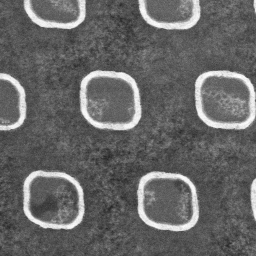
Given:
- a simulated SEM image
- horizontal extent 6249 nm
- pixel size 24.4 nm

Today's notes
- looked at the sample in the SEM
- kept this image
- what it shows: raised bodies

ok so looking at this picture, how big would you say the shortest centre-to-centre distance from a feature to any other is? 2.8 µm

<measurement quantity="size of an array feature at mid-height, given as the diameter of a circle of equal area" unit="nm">1390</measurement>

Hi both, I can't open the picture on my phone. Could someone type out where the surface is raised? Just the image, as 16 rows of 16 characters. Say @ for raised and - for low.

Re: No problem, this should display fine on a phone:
--@@@----@@@----
---@@-----@@----
----------------
----------------
----------------
@----@@@----@@@@
@----@@@@---@@@@
@-----@@-----@@@
----------------
----------------
----------------
--@@@----@@@----
--@@@----@@@----
--@@@----@@@----
----------------
----------------